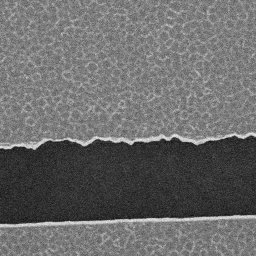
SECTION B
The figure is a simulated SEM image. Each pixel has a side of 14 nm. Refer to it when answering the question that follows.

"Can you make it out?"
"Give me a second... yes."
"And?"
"one or a few lines or trenches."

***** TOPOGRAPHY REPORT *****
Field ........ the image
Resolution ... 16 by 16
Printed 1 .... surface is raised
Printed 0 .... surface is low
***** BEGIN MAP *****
1111111111111111
1111111111111111
1111111111111111
1111111111111111
1111111111111111
1111111111111111
1111111111111111
1111111111111111
1111111111111100
0000000000000000
0000000000000000
0000000000000000
0000000000000000
0000000000000000
1111111111111111
1111111111111111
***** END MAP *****